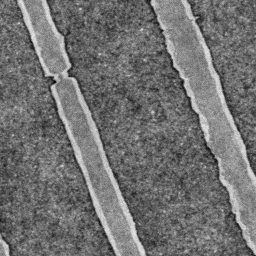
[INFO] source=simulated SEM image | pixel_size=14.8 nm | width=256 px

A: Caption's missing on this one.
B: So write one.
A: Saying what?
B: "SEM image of one or a few lines or trenches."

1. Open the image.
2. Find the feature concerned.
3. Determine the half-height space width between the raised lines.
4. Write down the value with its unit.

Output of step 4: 1520 nm